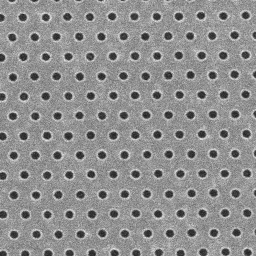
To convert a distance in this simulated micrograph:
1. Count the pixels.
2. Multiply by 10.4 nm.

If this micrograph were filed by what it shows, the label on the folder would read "a regular array of holes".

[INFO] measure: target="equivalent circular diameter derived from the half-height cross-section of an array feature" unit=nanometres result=89.6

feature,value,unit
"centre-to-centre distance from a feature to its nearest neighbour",229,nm